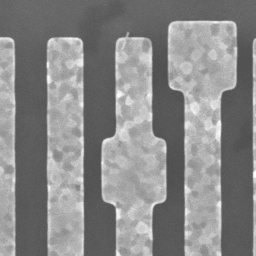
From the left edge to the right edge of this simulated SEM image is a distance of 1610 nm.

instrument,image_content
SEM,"wiring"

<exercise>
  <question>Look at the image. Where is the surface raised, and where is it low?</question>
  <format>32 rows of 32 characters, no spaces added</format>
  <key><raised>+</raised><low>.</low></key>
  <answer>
................................
................................
................................
.....................+++++++++..
.....................+++++++++..
++....++++.....++++..+++++++++..
++....++++.....++++..+++++++++..
++....++++.....++++..+++++++++..
++....++++.....++++..+++++++++..
++....++++.....++++..+++++++++..
++....++++.....++++..+++++++++..
++....++++.....++++....+++++....
++....++++.....++++....+++++....
++....++++.....++++....+++++....
++....++++.....++++....+++++....
++....++++.....++++....+++++....
++....++++....+++++....+++++....
++....++++...+++++++...+++++....
++....++++...++++++++..+++++....
++....++++...++++++++..+++++....
++....++++...++++++++..+++++....
++....++++...++++++++..+++++....
++....++++...++++++++..+++++....
++....++++...++++++++..+++++....
++....++++...++++++++..+++++....
++....++++....++++++...+++++....
++....++++.....++++....+++++....
++....++++.....++++....+++++....
++....++++.....++++....+++++....
++....++++.....++++....+++++....
++....++++.....++++....+++++....
++....++++.....++++....+++++....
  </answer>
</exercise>